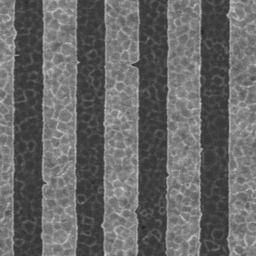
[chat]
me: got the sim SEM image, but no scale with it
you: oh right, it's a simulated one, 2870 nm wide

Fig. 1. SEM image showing one or a few lines or trenches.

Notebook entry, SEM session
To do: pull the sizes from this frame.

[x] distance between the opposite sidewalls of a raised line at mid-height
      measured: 0.36 µm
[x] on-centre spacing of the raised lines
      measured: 693 nm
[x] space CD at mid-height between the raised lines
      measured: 0.332 µm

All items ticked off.